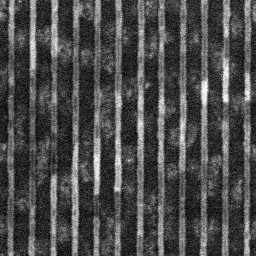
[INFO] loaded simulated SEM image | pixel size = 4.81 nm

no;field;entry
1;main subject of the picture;parallel lines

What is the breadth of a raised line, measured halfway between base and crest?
4.26 pixels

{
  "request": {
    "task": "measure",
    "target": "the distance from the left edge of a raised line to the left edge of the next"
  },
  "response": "0.103 um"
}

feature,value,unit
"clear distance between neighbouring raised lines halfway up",83.6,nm